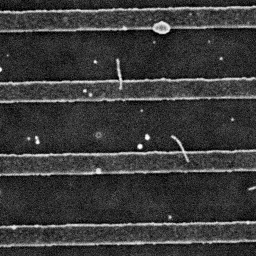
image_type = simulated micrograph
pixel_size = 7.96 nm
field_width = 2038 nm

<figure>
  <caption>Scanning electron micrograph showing lines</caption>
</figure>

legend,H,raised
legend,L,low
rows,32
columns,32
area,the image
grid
LLLLLLLLLLLLLLLLLLLLLLLLLLLLLLLL
HHLHHHHHHHHHHHHHHHHHHHHHHHHHHHHH
HHHHHHHHHHHHHHHHHHHHHHHHHHHHHHHH
HHHHHHHHHHHHHHHHHLHHHHLLLLLLLLLL
LLLLLLLLLLLLLLLLLLLLLLLLLLLLLLLL
LLLLLLLLLLLLLLLLLLLLLLLLLLLLLLLL
LLLLLLLLLLLLLLLLLLLLLLLLLLLLLLLL
LLLLLLLLLLLLLLLLLLLLLLLLLLLLLLLL
LLLLLLLLLLLLLLLLLLLLLLLLLLLLLLLL
LLLLLLLLLLLLLLLLLLLLLLLLLLLLLLLL
HHHHHHHHHHHHHHHHHHHHHHHHHHHHHHHH
HHHHHHHHHHHHHHHHHHHHHHHHHHHHHHHH
HHHHHHHHHHHHHLLLLLLLLLLLLLLLLLLL
LLLLLLLLLLLLLLLLLLLLLLLLLLLLLLLL
LLLLLLLLLLLLLLLLLLLLLLLLLLLLLLLL
LLLLLLLLLLLLLLLLLLLLLLLLLLLLLLLL
LLLLLLLLLLLLLLLLLLLLLLLLLLLLLLLL
LLLLLLLLLLLLLLLLLLLLLLLLLLLLLLLL
LLLLLLLLLLLLLLLLLLLLLLLLLLLLLLLL
HHHHHHHHHHHHHHHHHHHHHHHHHHHHHHHH
HHHHHHHHHHHHHHHHHHHHHHHHHHHHHHHH
HHHHHHHHHHHHHHHHHHHHLLLLLLLLLLLL
LLLLLLLLLLLLLLLLLLLLLLLLLLLLLLLL
LLLLLLLLLLLLLLLLLLLLLLLLLLLLLLLL
LLLLLLLLLLLLLLLLLLLLLLLLLLLLLLLL
LLLLLLLLLLLLLLLLLLLLLLLLLLLLLLLL
LLLLLLLLLLLLLLLLLLLLLLLLLLLLLLLL
LLLLLLLLLLLLLLLLLLLLLLLLLLLLLLLL
HHHHHHHHHHHHHHHHHHHHHHHHHHHHHHHH
HHHHHHHHHHHHHHHHHHHHHHHHHHHHHHHH
HHHHHHHHHHHLLLLLLLLLLLLLLLLLLLLL
LLLLLLLLLLLLLLLLLLLLLLLLLLLLLLLL